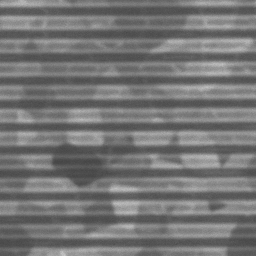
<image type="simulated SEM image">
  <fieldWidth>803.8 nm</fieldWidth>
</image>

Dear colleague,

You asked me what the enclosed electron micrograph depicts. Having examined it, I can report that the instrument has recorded parallel lines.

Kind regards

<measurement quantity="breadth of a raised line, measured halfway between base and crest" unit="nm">40.1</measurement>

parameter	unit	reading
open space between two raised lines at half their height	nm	32.2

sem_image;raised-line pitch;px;23.2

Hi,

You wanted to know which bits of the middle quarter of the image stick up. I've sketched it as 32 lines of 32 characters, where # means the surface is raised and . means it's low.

################################
################################
################################
................................
................................
................................
################################
################################
############################....
................................
................................
##################.#############
################################
################################
................................
................................
................................
################################
################################
################################
................................
................................
................................
################################
################################
################################
................................
................................
................................
################################
################################
################################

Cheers